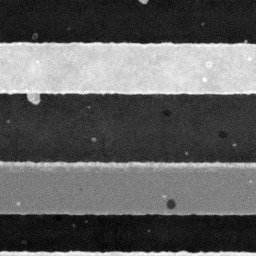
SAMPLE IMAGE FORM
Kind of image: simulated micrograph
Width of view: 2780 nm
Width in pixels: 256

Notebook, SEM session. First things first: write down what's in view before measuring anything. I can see lines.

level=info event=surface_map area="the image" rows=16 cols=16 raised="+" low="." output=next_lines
................
................
................
++++++++++++++++
++++++++++++++++
++++++++++++++++
................
................
................
................
++++++++++++++++
++++++++++++++++
++++++++++++++++
................
................
................